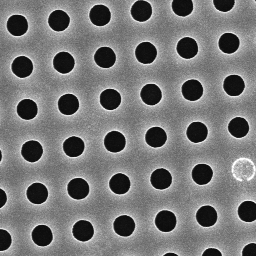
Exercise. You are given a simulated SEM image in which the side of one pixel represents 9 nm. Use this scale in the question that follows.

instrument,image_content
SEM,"a regular array of holes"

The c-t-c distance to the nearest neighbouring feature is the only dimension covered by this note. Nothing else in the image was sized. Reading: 0.372 microns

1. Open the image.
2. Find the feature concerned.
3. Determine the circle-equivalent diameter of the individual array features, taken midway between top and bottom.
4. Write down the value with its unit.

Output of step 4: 196 nm